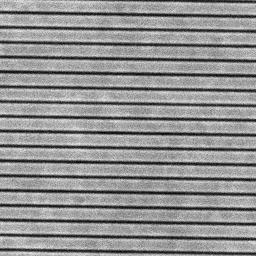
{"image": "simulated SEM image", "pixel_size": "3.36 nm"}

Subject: parallel lines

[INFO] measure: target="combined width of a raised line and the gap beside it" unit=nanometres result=49.8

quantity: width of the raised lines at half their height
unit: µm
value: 0.0369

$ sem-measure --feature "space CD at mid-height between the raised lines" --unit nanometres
13.8